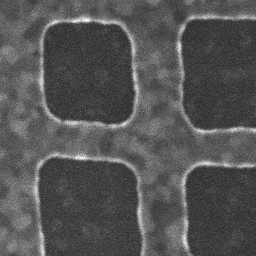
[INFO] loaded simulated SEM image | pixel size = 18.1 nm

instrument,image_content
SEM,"holes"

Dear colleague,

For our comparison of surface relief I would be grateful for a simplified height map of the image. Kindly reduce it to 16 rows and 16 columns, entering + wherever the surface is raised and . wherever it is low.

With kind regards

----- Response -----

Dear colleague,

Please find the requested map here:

++++++++++++++++
+++....+++++....
+++.....+++.....
+++.....+++.....
+++.....+++.....
+++.....+++.....
+++.....+++.....
++++....++++....
++++++++++++++++
++++++++++++++++
++......++++....
++.......+++....
++.......+++....
++.......+++....
+++......+++....
+++......+++....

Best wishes